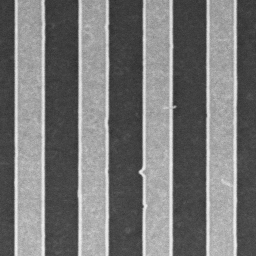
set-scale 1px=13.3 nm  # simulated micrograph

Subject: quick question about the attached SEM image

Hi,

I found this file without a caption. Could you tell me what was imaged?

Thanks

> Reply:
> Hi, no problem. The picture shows one or a few lines or trenches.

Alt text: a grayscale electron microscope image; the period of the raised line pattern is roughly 854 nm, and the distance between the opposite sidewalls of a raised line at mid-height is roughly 26.9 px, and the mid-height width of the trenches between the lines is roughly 490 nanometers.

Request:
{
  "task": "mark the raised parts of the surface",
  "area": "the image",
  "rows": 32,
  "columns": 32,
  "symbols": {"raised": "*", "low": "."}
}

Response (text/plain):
..***.....***.....***.....***...
..***.....***.....***.....***...
..***.....***.....***.....***...
..***.....***.....***.....***...
..***.....***.....***.....***...
..***.....***.....***.....***...
..***.....***.....***.....***...
..***.....***.....***.....***...
..***.....***.....***.....***...
..***.....***.....***.....***...
..***.....***.....***.....***...
..***.....***.....***.....***...
..***.....***.....***.....***...
..***.....***.....***.....***...
..***.....***.....***.....***...
..***.....***.....***.....***...
..***.....***.....***.....***...
..***.....***.....***.....***...
..***.....***.....***.....***...
..***.....***.....***.....***...
..***.....***.....***.....***...
..***.....***.....***.....***...
..***.....***.....***.....***...
..***.....***.....***.....***...
..***.....***.....***.....***...
..***.....***.....***.....***...
..***.....***.....***.....***...
..***.....***.....***.....***...
..***.....***.....***.....***...
..***.....***.....***.....***...
..***.....***.....***.....***...
..***.....***.....***.....***...